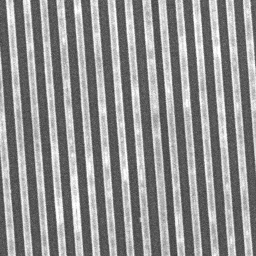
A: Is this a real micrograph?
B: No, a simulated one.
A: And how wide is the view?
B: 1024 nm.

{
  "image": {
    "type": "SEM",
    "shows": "parallel lines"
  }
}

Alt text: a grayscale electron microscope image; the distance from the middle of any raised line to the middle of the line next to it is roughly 16.9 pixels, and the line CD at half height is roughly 25.4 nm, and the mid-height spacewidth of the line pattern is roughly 40.4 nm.